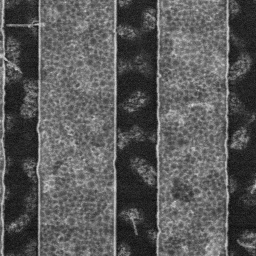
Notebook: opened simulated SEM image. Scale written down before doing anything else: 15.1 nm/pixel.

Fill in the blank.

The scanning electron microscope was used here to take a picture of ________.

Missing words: one or a few lines or trenches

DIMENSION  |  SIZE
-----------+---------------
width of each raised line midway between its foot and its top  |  1090 nanometers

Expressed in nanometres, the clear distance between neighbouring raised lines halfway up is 605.